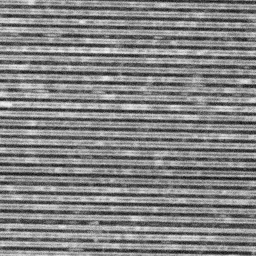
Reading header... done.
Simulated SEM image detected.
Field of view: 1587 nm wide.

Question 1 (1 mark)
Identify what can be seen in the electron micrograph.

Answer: parallel lines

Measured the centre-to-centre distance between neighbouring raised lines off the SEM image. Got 57.7 nm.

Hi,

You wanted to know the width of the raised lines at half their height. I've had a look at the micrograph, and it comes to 27.1 nanometers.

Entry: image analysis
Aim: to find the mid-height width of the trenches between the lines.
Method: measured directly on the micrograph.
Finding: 27.9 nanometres